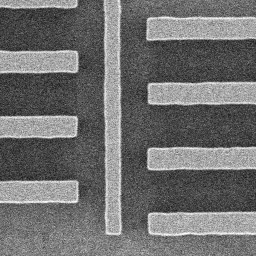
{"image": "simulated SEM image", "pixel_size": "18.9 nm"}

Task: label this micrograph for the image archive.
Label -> groups of lines, slits or small figures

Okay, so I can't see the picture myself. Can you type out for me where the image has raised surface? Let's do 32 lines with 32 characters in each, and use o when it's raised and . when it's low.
oooooooooo...oo.................
.............oo.................
.............oo....ooooooooooooo
.............oo...oooooooooooooo
.............oo...oooooooooooooo
.............oo.................
ooooooooo....oo.................
oooooooooo...oo.................
oooooooooo...oo.................
.............oo.................
.............oo....ooooooooooooo
.............oo....ooooooooooooo
.............oo....ooooooooooooo
.............oo.................
.............oo.................
oooooooooo...oo.................
oooooooooo...oo.................
.............oo.................
.............oo................o
.............oo....ooooooooooooo
.............oo....ooooooooooooo
.............oo.................
.............oo.................
oooooooooo...oo.................
oooooooooo...oo.................
.............oo.................
.............oo.................
.............oo....ooooooooooooo
.............oo....ooooooooooooo
................................
................................
................................